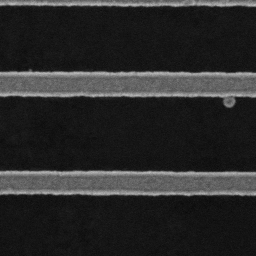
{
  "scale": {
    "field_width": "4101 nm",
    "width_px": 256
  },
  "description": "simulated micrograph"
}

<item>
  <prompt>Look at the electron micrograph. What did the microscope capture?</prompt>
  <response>lines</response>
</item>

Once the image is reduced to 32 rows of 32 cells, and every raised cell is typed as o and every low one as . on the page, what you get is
oooooooooooooooooooooooooooooooo
................................
................................
................................
................................
................................
................................
................................
................................
oooooooooooooooooooooooooooooooo
oooooooooooooooooooooooooooooooo
oooooooooooooooooooooooooooooooo
................................
................................
................................
................................
................................
................................
................................
................................
................................
.o..o...........................
oooooooooooooooooooooooooooooooo
oooooooooooooooooooooooooooooooo
................................
................................
................................
................................
................................
................................
................................
................................